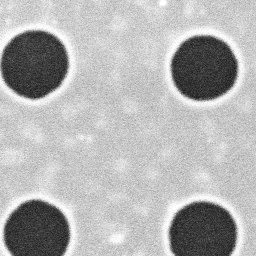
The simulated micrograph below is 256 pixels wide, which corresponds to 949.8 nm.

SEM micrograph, holes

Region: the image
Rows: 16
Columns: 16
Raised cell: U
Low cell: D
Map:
UUUUUUUUUUUUUUUU
UUUUUUUUUUUUUUUU
UDDDUUUUUUUUDDUU
DDDDUUUUUUUDDDDU
DDDDUUUUUUUDDDDU
UDDDUUUUUUUDDDDU
UUUUUUUUUUUUUUUU
UUUUUUUUUUUUUUUU
UUUUUUUUUUUUUUUU
UUUUUUUUUUUUUUUU
UUUUUUUUUUUUUUUU
UUUUUUUUUUUUUUUU
UUDUUUUUUUUUUUUU
UDDDUUUUUUUDDDDU
DDDDUUUUUUUDDDDU
DDDDUUUUUUUDDDDU